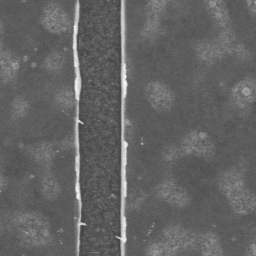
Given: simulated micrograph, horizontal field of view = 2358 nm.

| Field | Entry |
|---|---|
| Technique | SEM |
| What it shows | one or a few lines or trenches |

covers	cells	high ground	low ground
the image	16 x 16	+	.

+++++...++++++++
+++++...++++++++
+++++...++++++++
+++++...++++++++
+++++...++++++++
+++++...++++++++
+++++...++++++++
+++++...++++++++
+++++...++++++++
+++++...++++++++
+++++...++++++++
+++++...++++++++
+++++...++++++++
+++++...++++++++
+++++...++++++++
+++++...++++++++